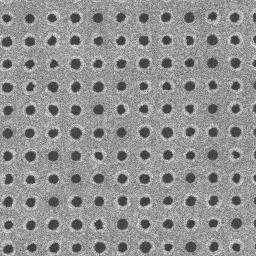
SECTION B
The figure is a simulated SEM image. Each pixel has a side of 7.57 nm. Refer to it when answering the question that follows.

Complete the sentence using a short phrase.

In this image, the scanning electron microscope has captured a regular array of holes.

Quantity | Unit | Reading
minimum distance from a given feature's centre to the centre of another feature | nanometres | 170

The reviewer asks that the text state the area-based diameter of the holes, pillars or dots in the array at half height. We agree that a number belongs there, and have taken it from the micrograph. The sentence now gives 74.5 nm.